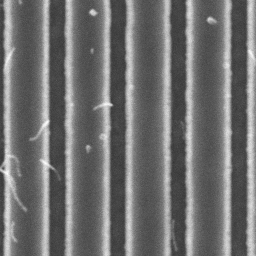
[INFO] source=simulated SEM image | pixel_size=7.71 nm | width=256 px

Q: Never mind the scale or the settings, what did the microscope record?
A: lines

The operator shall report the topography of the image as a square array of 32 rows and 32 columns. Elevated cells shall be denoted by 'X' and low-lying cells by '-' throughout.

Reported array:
-XXXXX--XXXXXX--XXXXX--XXXXXX--X
-XXXXX--XXXXXX--XXXXX--XXXXXX--X
-XXXXX--XXXXXX--XXXXX--XXXXXX--X
-XXXXX--XXXXXX--XXXXX--XXXXXX--X
-XXXXX--XXXXXX--XXXXX--XXXXXX--X
-XXXXX--XXXXXX--XXXXX--XXXXXX--X
-XXXXX--XXXXXX--XXXXX--XXXXXX--X
-XXXXX--XXXXXX--XXXXX--XXXXXX--X
-XXXXX--XXXXXX--XXXXX--XXXXXX--X
-XXXXX--XXXXXX--XXXXX--XXXXXX--X
-XXXXX--XXXXXX--XXXXX--XXXXXX--X
-XXXXX--XXXXXX--XXXXX--XXXXXX--X
-XXXXX--XXXXXX--XXXXX--XXXXXX--X
-XXXXX--XXXXXX--XXXXX--XXXXXX--X
-XXXXX--XXXXXX--XXXXX--XXXXXX--X
-XXXXX--XXXXXX--XXXXX--XXXXXX--X
-XXXXX--XXXXXX--XXXXX--XXXXXX--X
-XXXXX--XXXXXX--XXXXX--XXXXXX--X
-XXXXX--XXXXXX--XXXXX--XXXXXX--X
-XXXXX--XXXXXX--XXXXX--XXXXXX--X
-XXXXX--XXXXXX--XXXXX--XXXXXX--X
XXXXXX--XXXXXX--XXXXX--XXXXXX--X
-XXXXX--XXXXXX--XXXXX--XXXXXX--X
-XXXXX--XXXXXX--XXXXX--XXXXXX--X
-XXXXX--XXXXXX--XXXXX--XXXXXX--X
-XXXXX--XXXXXX--XXXXX--XXXXXX--X
-XXXXX--XXXXX---XXXXX--XXXXXX--X
-XXXXX--XXXXXX--XXXXX--XXXXXX--X
-XXXXX--XXXXXX--XXXXX--XXXXXX--X
-XXXXX--XXXXXX--XXXXX--XXXXXX--X
-XXXXX--XXXXXX--XXXXX--XXXXXX--X
-XXXXX--XXXXXX--XXXXX--XXXXXX--X